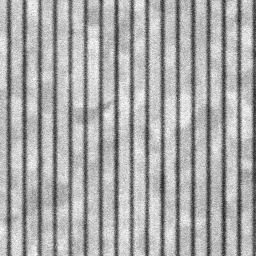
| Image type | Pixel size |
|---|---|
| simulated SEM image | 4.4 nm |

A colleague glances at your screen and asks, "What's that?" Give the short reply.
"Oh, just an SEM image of parallel lines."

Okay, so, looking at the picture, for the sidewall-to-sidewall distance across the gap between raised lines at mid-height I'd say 3.89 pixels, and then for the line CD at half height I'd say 0.0506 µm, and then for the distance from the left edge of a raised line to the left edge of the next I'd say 67.5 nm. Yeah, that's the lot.